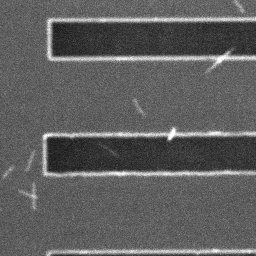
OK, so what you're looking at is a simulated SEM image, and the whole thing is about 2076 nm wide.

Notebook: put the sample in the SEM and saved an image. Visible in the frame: one or a few lines or trenches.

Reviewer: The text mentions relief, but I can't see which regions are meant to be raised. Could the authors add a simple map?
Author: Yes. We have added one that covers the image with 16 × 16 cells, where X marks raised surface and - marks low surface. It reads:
XXXXXXXXXXXXXXXX
XXX-------------
XXX-------------
XXXX------------
XXXXXXXXXXXXXXXX
XXXXXXXXXXXXXXXX
XXXXXXXXXXXXXXXX
XXXXXXXXXXXXXXXX
XXX-X-----------
XXX-------------
XXX-------------
XXXXXXXXXXXXXXXX
XXXXXXXXXXXXXXXX
XXXXXXXXXXXXXXXX
XXXXXXXXXXXXXXXX
XXXXXXXXXXXXXXXX